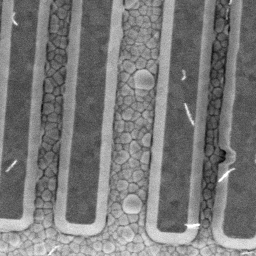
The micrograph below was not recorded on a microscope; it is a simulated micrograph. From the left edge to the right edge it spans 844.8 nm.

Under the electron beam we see one or a few lines or trenches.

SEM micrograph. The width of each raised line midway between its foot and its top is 0.132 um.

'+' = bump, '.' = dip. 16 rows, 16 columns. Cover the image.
+++..++....++..+
+++..++...+++..+
+++..++...+++..+
++...++...+++..+
++...++...+++.++
++..+++...+++.++
++..+++...+++.++
++..+++...+++.++
++..+++...++..++
++..+++...++..++
++..+++...++..++
++..++....++..++
++..++....++..++
++..++...+++..++
..........++..++
................